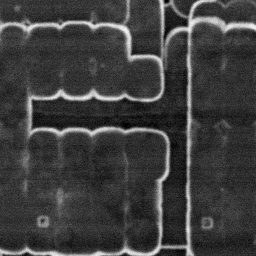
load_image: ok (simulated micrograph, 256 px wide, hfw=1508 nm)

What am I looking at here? wiring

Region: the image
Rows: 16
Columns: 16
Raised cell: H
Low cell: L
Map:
LLLLLLLLLLLLLLLL
HLLLHHLLLLLLHHLL
HHHHHHHHLLLLHHHH
HHHHHHHHHLLLHHHH
HHHHHHHHHHLLHHHH
HHHHHHHHHHLLHHHH
HHLLLLLLLLLLHHHH
HHLLLLLLLLLLHHHH
HHHHHHHHHHLLHHHH
HHHHHHHHHHHLHHHH
HHHHHHHHHHHLHHHH
HHHHHHHHHHLLHHHH
HHHHHHHHHHLLHHHH
HHHHHHHHHHLLHHHH
HHHHHHHHHHLLHHHH
HHHHHHHHHHLLHHHH